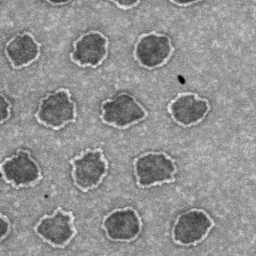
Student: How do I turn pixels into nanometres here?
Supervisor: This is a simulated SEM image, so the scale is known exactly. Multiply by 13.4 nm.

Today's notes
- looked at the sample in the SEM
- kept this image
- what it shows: a regular array of raised bodies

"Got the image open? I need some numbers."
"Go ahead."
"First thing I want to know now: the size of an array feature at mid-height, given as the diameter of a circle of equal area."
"475 nanometres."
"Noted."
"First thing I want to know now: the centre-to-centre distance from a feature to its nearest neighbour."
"883 nm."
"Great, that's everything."